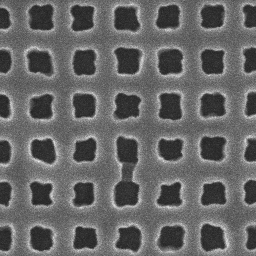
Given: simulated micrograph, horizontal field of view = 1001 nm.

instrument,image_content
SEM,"a regular array of holes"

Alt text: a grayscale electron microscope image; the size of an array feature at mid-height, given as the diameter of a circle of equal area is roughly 100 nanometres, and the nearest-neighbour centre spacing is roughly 0.166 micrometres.